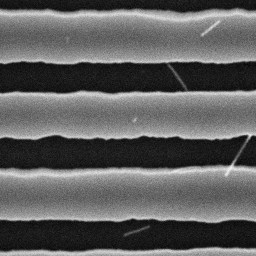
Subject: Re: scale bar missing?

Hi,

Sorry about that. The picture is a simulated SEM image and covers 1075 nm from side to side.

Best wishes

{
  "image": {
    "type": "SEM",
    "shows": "lines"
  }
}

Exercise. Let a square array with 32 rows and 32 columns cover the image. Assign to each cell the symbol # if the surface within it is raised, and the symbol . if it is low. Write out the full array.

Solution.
................................
#.#####.......####...........##.
################################
################################
################################
################################
################################
################################
................................
................................
................................
.##......####......#..##########
################################
################################
################################
################################
################################
................................
................................
................................
................................
###.############################
################################
################################
################################
################################
################################
.####....#######....#.#######.##
................................
................................
................................
.########.######################